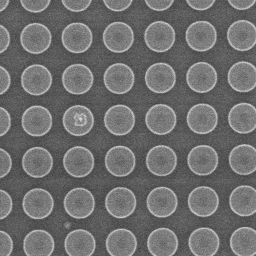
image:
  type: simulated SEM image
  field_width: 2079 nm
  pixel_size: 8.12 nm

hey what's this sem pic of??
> an array of small figures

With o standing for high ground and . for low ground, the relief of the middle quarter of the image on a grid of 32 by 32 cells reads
..ooo.......oooo......oooo......
oooooo.....oooooo....oooooo....o
ooooooo...ooooooo....ooooooo...o
ooooooo...ooooooo...oooooooo...o
ooooooo...ooooooo...oooooooo...o
ooooooo...ooooooo....oooooo....o
.ooooo.....ooooo......oooo......
................................
................................
................................
...o.........oo.......oooo......
.ooooo.....oooooo....oooooo.....
ooooooo...ooooooo....ooooooo...o
ooooooo...ooooooo....ooooooo...o
ooooooo...oooooooo...ooooooo...o
ooooooo...ooooooo....ooooooo...o
.ooooo.....oooooo.....ooooo.....
..ooo........oo........oo.......
................................
................................
.......................oo.......
.ooooo.....ooooo......ooooo.....
ooooooo....oooooo....ooooooo...o
ooooooo...oooooooo...ooooooo...o
ooooooo...oooooooo...ooooooo...o
ooooooo....ooooooo...ooooooo...o
.oooooo....oooooo....oooooo.....
.ooooo......oooo......oooo......
................................
................................
................................
..oooo......oooo......ooooo.....